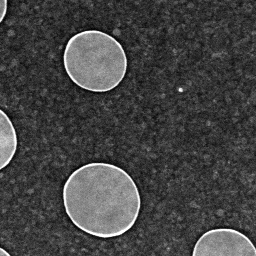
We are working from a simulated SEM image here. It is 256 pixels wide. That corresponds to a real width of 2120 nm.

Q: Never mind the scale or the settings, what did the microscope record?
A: raised bodies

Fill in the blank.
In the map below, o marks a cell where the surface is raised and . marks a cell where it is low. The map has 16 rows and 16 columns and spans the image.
................
................
.....oo.........
....oooo........
....oooo........
.....oo.........
................
o...............
o...............
o...............
.....oo.........
....oooo........
....ooooo.......
....ooooo.......
......oo.....oo.
............oooo